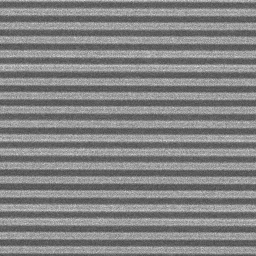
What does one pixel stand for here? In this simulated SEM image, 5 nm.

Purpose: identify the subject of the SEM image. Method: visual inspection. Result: parallel lines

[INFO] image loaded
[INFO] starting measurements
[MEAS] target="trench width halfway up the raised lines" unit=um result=0.0356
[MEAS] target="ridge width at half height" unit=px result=7.12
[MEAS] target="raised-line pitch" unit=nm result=70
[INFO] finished